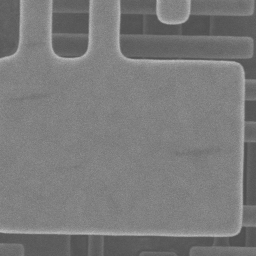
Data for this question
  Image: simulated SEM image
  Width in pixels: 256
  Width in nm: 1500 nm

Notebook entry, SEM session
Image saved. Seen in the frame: wiring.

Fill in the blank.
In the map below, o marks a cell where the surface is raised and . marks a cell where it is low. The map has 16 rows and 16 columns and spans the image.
.oo...o...oo....
.oo...o.........
.oo...o.........
oooo.ooo........
ooooooooooooooo.
ooooooooooooooo.
ooooooooooooooo.
ooooooooooooooo.
ooooooooooooooo.
ooooooooooooooo.
ooooooooooooooo.
ooooooooooooooo.
ooooooooooooooo.
ooooooooooooooo.
ooooooooooooooo.
................